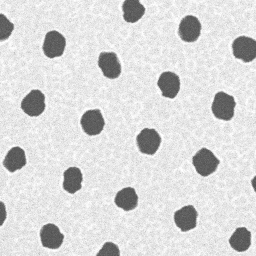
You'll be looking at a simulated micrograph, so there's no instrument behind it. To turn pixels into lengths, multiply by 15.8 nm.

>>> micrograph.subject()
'a regular array of holes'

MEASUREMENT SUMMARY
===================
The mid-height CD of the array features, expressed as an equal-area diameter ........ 393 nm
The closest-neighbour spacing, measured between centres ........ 58.9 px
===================